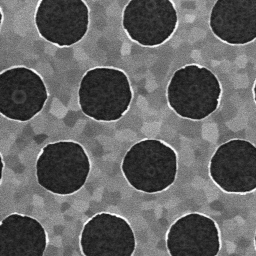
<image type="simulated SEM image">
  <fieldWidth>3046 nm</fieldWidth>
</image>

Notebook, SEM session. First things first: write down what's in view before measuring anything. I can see holes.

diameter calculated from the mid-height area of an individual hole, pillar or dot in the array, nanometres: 640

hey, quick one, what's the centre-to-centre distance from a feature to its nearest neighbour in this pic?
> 1010 nm